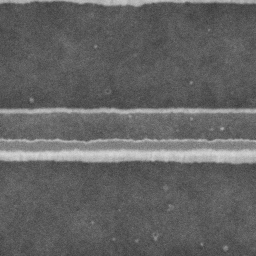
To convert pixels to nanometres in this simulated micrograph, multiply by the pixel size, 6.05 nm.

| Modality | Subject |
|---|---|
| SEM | lines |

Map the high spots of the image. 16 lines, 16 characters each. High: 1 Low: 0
0000000000000000
0000000000000000
0000000000000000
0000000000000000
0000000000000000
0000000000000000
0000000000000000
1111111111111111
1111111111111111
1111111111111111
0000000000000000
0000000000000000
0000000000000000
0000000000000000
0000000000000000
0000000000000000